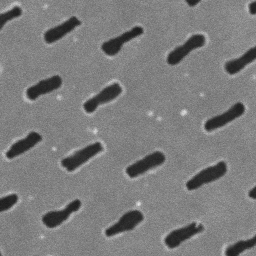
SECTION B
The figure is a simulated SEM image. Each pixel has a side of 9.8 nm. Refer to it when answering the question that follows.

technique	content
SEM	a regular array of holes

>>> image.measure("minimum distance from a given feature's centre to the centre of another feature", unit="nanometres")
582